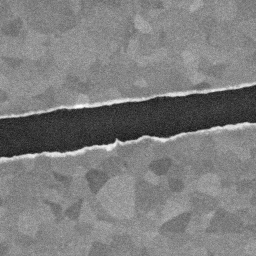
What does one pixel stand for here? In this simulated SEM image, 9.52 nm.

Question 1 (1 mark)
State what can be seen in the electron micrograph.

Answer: one or a few lines or trenches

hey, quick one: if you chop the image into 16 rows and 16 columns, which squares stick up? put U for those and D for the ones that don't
UUUUUUUUUUUUUUUU
UUUUUUUUUUUUUUUU
UUUUUUUUUUUUUUUU
UUUUUUUUUUUUUUUU
UUUUUUUUUUUUUUUU
UUUUUUUUUUUUUUUD
UUUUUUUDDDDDDDDD
DDDDDDDDDDDDDDDD
DDDDDDDDDDDUUUUU
DDDDDUUUUUUUUUUU
UUUUUUUUUUUUUUUU
UUUUUUUUUUUUUUUU
UUUUUUUUUUUUUUUU
UUUUUUUUUUUUUUUU
UUUUUUUUUUUUUUUU
UUUUUUUUUUUUUUUU